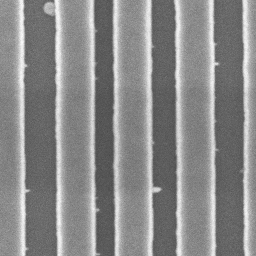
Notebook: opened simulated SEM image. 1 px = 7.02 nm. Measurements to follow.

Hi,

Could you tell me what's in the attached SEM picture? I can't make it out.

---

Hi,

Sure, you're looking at lines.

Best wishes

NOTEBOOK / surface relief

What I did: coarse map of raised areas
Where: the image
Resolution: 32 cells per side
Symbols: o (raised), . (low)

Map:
ooo....ooooo..ooooo...ooooo...oo
ooo....ooooo..ooooo...ooooo...oo
ooo....ooooo..ooooo...ooooo...oo
ooo....ooooo..ooooo...ooooo....o
ooo....ooooo..ooooo...ooooo....o
ooo....ooooo..ooooo...ooooo....o
ooo....ooooo..ooooo...ooooo....o
ooo....ooooo..ooooo...ooooo....o
ooo....ooooo..ooooo...ooooo...oo
ooo....ooooo..ooooo...ooooo....o
ooo....ooooo..ooooo...ooooo....o
ooo....ooooo..ooooo...ooooo....o
ooo....ooooo..ooooo...ooooo....o
ooo....ooooo..ooooo...ooooo....o
ooo....ooooo..ooooo...ooooo....o
ooo....ooooo..ooooo...ooooo....o
ooo....ooooo..ooooo...ooooo....o
ooo....ooooo..ooooo...ooooo....o
ooo....ooooo..ooooo...ooooo....o
ooo....ooooo..ooooo...ooooo....o
ooo....ooooo..ooooo...ooooo....o
ooo....ooooo..ooooo...ooooo....o
ooo....ooooo..ooooo...ooooo....o
ooo....ooooo..ooooo...ooooo....o
ooo....ooooo..ooooo...ooooo....o
ooo....ooooo..ooooo...ooooo....o
ooo....ooooo..ooooo...ooooo....o
ooo....ooooo..ooooo...ooooo....o
ooo....ooooo..ooooo...ooooo....o
ooo....ooooo..ooooo...ooooo....o
ooo....ooooo..ooooo...ooooo....o
ooo....ooooo..ooooo...ooooo....o